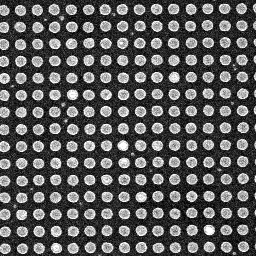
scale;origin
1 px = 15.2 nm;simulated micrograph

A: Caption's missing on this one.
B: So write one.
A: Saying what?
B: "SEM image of a regular array of raised bodies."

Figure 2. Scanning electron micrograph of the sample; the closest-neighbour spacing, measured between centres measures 253 nm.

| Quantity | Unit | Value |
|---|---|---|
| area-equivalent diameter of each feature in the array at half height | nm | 160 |